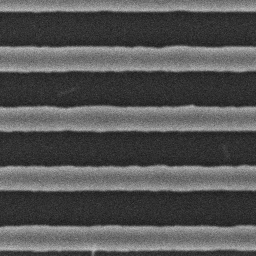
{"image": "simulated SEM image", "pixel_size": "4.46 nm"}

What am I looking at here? lines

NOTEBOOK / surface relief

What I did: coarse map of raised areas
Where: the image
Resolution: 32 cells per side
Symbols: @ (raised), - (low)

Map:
@@@@@@@@@@@@@@@@@@@@@@@@@@@@@@@@
--------------------------------
--------------------------------
--------------------------------
--------------------------------
--------------------------------
@@@@@@@@@@@@@@@@@@@@@@@@@@@@@@@@
@@@@@@@@@@@@@@@@@@@@@@@@@@@@@@@@
@@@@@@@@@@@@@@@@@@@@@@@@@@@@@@@@
--------------------------------
--------------------------------
--------------------------------
--------------------------------
--@@@@@--@@@@@@@@@@@@@@@@@@@@@@@
@@@@@@@@@@@@@@@@@@@@@@@@@@@@@@@@
@@@@@@@@@@@@@@@@@@@@@@@@@@@@@@@@
--------------------------------
--------------------------------
--------------------------------
--------------------------------
--------------------------------
@@@@@@@@@@@@@@@@@@@@@@@@@@@@@@@@
@@@@@@@@@@@@@@@@@@@@@@@@@@@@@@@@
@@@@@@@@@@@@@@@@@@@@@@@@@@@@@@@@
--------------------------------
--------------------------------
--------------------------------
--------------------------------
@@@@@@@@@@@@@@@@@@@@@@@@@@@@@@@@
@@@@@@@@@@@@@@@@@@@@@@@@@@@@@@@@
@@@@@@@@@@@@@@@@@@@@@@@@@@@@@@@@
--------------------------------